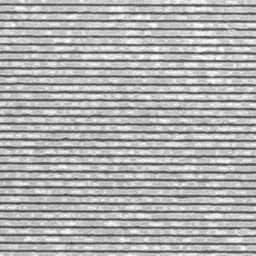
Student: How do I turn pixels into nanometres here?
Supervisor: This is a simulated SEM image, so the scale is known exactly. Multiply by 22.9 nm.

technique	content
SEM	parallel lines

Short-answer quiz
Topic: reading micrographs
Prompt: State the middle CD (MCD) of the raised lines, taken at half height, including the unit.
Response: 120 nm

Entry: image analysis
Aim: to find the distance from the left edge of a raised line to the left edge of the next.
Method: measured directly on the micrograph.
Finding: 182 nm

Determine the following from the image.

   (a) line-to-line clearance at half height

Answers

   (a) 0.0602 µm